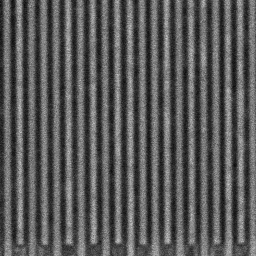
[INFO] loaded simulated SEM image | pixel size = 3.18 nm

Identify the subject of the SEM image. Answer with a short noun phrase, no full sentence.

parallel lines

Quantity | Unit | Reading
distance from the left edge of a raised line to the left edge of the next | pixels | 12.2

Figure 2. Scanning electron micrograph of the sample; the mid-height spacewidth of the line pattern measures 19.1 nm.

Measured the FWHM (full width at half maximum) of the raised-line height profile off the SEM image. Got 18.7 nm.